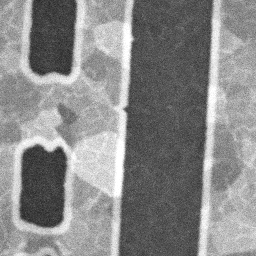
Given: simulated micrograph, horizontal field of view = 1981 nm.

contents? one or a few lines or trenches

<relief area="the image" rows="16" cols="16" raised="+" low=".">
++...+++......++
++...+++......++
++...+++.....+++
++...+++.....+++
++...+++.....+++
++++++++.....+++
++++++++.....+++
++++++++.....+++
++++++++.....+++
+...+++......+++
+...+++......+++
+...+++......+++
+...+++......+++
+...+++......+++
+++++++......+++
+++++++......+++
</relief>